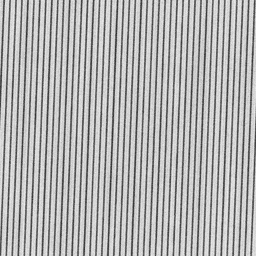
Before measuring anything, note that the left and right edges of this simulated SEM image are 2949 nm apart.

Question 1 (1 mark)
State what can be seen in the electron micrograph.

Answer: parallel lines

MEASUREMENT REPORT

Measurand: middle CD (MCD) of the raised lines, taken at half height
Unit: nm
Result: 43.2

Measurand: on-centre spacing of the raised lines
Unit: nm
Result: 68.7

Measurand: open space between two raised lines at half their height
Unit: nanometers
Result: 21.6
